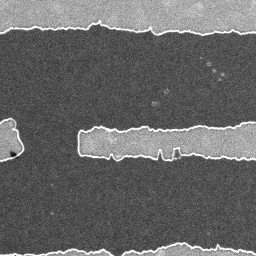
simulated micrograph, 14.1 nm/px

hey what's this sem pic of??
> one or a few lines or trenches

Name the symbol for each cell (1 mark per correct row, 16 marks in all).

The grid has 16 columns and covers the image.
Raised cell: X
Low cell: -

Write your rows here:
----------------
----------------
XXXXXXXXXXXXXXXX
XXXXXXXXXXXXXXXX
XXXXXXXXXXXXXXXX
XXXXXXXXXXXXXXXX
XXXXXXXXXXXXXXXX
XXXXXXXXXXXXXXXX
-XXXX-----------
-XXXX-----------
XXXXXXXXXXXXXXXX
XXXXXXXXXXXXXXXX
XXXXXXXXXXXXXXXX
XXXXXXXXXXXXXXXX
XXXXXXXXXXXXXXXX
XXXXXXXXXX--XXXX